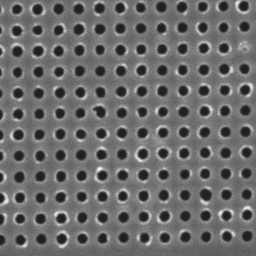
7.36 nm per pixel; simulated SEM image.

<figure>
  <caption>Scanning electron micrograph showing a regular array of holes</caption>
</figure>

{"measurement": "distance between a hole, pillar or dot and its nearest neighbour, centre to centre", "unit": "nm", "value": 150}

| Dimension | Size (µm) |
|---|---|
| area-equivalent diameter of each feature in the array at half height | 0.0805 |